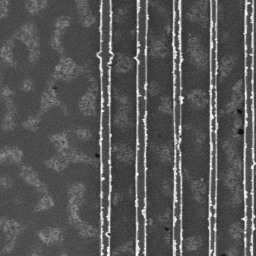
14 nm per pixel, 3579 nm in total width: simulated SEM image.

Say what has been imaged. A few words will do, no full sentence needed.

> parallel lines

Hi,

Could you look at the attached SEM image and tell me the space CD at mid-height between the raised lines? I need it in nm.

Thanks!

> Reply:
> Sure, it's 388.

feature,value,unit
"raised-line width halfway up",0.124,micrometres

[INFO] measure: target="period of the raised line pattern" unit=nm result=501